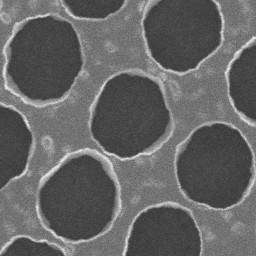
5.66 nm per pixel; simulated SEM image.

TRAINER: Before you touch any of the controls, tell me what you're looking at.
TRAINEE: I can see holes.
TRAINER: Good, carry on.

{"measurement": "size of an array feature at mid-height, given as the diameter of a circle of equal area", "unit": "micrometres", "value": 0.457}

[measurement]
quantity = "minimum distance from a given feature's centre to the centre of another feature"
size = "0.557 micrometres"